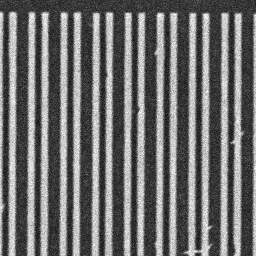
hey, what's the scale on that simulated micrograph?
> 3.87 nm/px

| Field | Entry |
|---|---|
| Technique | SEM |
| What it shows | parallel lines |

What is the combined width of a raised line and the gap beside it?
62.3 nm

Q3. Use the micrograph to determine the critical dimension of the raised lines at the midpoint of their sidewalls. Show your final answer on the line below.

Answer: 22.7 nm